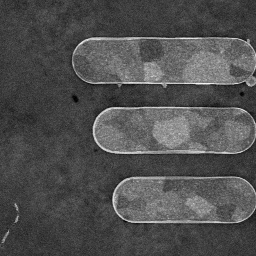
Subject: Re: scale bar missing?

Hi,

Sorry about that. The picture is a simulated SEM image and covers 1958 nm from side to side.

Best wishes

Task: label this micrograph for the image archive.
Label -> groups of lines, slits or small figures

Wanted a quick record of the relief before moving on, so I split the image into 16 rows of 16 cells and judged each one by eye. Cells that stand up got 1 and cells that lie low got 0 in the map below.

0000000000000000
0000000000000000
0000001111111110
0000011111111111
0000011111111111
0000000000000000
0000000000000000
0000001111111111
0000001111111111
0000000110000110
0000000000000000
0000000011111111
0000000111111111
0000000011111111
0000000000000000
0000000000000000